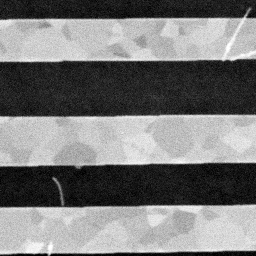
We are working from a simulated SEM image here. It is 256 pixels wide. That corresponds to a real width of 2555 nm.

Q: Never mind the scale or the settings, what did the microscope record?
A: lines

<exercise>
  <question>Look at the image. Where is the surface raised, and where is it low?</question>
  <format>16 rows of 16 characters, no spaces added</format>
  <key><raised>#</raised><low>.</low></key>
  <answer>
................
################
################
################
................
................
................
################
################
################
................
................
................
################
################
################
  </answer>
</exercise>